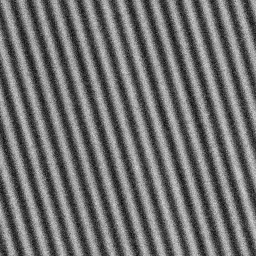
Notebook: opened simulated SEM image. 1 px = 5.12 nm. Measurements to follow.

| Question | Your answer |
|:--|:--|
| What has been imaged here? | parallel lines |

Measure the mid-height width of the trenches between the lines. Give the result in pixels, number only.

9.96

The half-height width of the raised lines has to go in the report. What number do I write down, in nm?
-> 32.5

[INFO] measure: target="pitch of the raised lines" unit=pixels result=16